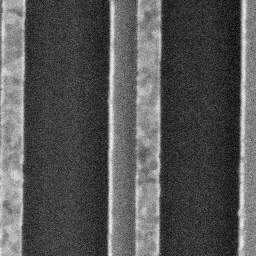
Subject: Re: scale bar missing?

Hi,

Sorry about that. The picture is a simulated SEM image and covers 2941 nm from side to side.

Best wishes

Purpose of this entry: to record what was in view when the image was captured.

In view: lines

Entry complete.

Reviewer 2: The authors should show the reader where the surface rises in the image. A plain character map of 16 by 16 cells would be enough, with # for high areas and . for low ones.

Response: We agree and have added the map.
#......###.....#
#......###.....#
#......###.....#
#......###.....#
#......###.....#
#......###.....#
#......###.....#
#......###.....#
#......###.....#
#......###.....#
#......###.....#
#......###.....#
#......###.....#
#......###.....#
#......###.....#
#......###.....#